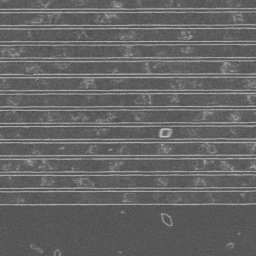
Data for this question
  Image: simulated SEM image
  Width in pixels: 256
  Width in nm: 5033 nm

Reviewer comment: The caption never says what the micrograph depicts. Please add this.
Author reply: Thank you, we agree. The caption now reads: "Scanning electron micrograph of parallel lines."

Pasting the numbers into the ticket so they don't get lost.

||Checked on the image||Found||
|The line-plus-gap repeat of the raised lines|320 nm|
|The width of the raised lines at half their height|66.4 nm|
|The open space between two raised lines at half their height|0.251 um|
